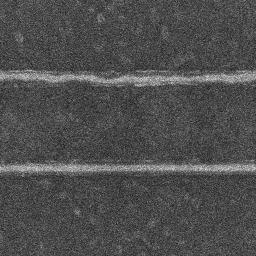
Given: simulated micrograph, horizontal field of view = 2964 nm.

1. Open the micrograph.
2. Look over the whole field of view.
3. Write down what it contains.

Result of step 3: one or a few lines or trenches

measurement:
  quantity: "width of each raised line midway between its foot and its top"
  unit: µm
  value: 1.04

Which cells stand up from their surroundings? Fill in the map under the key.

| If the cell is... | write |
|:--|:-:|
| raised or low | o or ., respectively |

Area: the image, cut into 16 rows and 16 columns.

................
................
................
................
................
oooooooooooooooo
oooooooooooooooo
oooooooooooooooo
oooooooooooooooo
oooooooooooooooo
....ooo.....oo..
................
................
................
................
................